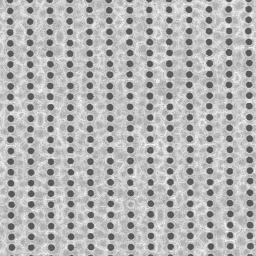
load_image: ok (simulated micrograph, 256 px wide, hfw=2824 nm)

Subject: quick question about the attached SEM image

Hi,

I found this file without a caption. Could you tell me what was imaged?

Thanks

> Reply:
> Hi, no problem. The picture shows a regular array of holes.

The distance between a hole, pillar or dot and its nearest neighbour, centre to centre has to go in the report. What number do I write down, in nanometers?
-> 117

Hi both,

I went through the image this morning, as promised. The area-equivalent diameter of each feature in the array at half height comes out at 74.7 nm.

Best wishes